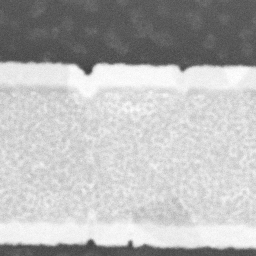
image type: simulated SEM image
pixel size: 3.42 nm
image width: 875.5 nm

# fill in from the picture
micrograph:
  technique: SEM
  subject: one or a few lines or trenches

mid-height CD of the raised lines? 543 nm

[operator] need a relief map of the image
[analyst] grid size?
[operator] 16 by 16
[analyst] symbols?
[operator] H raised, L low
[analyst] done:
LLLLLLLLLLLLLLLL
LLLLLLLLLLLLLLLL
LLLLLLLLLLLLLLLL
LLLLLLLLLLLLLLLL
LLLLLLLLLLLLLLLL
HHHHHHHHHHHHHHHH
HHHHHHHHHHHHHHHH
HHHHHHHHHHHHHHHH
HHHHHHHHHHHHHHHH
HHHHHHHHHHHHHHHH
HHHHHHHHHHHHHHHH
HHHHHHHHHHHHHHHH
HHHHHHHHHHHHHHHH
HHHHHHHHHHHHHHHH
HHHHHHHHHHHHHHHH
LLLLLLLLLLLLLLLL